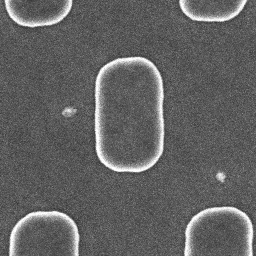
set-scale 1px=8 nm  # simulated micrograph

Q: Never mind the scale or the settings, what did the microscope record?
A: raised bodies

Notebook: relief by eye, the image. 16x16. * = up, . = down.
****.......****.
.**.............
................
................
......****......
......****......
......****......
......****......
......****......
......****......
.......**.......
................
................
..**........***.
.****.......****
.****.......****